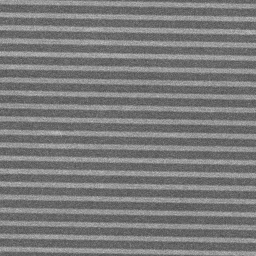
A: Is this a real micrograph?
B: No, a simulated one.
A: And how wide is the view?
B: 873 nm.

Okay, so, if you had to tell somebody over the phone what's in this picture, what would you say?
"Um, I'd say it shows parallel lines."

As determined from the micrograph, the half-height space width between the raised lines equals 29.9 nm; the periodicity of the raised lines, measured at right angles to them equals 44.4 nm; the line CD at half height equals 0.0149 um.